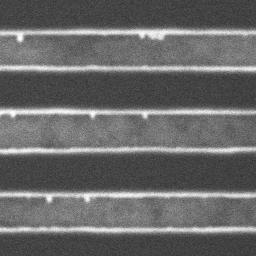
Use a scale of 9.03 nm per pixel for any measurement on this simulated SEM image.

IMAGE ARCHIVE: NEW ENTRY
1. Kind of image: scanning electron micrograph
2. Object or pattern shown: lines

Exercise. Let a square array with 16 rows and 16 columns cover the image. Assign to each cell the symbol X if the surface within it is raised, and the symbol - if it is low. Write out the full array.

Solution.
XXXXXXXXXXXXXXXX
XXXXXXXXXXXXXXXX
----------------
----------------
XXXXXXXXXXXXXXXX
XXXXXXXXXXXXXXXX
XXXXXXXXXXXXXXXX
----------------
----------------
XXXXXXXXXXXXXXXX
XXXXXXXXXXXXXXXX
XXXXXXXXXXXXXXXX
----------------
----------------
XXXXXXXXXXXXXXXX
XXXXXXXXXXXXXXXX